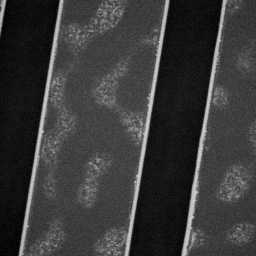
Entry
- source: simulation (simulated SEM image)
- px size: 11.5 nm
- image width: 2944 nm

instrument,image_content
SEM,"one or a few lines or trenches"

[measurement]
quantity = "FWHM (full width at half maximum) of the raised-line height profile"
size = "1.2 um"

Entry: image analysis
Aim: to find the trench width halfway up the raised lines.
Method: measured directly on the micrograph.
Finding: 56.5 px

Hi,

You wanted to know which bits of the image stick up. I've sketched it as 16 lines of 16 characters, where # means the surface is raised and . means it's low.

....######....##
....######....##
...#######....##
...#######...###
...#######...###
...#######...###
...######....###
...######....###
..#######....###
..#######...####
..#######...####
..#######...####
..######....####
..######....####
..######....####
.#######....####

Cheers